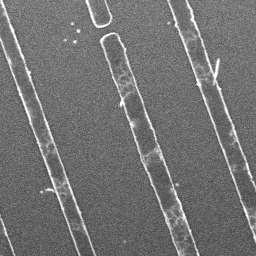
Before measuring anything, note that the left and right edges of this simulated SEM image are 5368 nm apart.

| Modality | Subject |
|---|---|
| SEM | one or a few lines or trenches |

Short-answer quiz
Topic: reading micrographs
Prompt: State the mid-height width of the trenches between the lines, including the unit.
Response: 1280 nm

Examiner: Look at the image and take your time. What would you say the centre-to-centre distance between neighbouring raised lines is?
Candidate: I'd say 1830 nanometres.